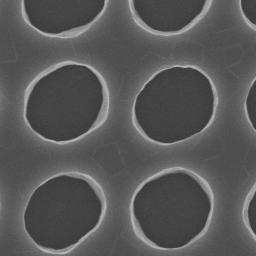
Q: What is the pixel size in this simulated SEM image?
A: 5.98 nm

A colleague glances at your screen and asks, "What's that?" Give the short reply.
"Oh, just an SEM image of holes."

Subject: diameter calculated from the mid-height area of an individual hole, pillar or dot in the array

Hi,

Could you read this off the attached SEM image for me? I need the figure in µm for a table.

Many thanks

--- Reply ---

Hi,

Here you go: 0.466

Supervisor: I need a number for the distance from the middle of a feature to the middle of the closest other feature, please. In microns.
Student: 0.635